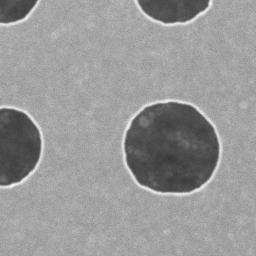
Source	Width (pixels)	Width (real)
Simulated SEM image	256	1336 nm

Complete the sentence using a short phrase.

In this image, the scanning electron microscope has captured holes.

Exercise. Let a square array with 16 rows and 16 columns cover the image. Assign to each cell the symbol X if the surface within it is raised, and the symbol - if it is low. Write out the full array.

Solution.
--XXXXXXX----XXX
XXXXXXXXXXXXXXXX
XXXXXXXXXXXXXXXX
XXXXXXXXXXXXXXXX
XXXXXXXXXXXXXXXX
XXXXXXXXXXXXXXXX
XXXXXXXXXX--XXXX
--XXXXXX-----XXX
---XXXXX------XX
---XXXXX------XX
--XXXXXX-----XXX
-XXXXXXXX----XXX
XXXXXXXXXXXXXXXX
XXXXXXXXXXXXXXXX
XXXXXXXXXXXXXXXX
XXXXXXXXXXXXXXXX